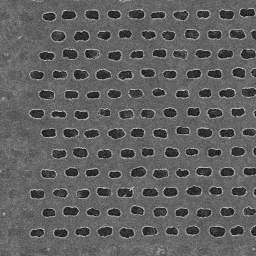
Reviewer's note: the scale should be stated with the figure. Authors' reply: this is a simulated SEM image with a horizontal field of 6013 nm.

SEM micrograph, a regular array of holes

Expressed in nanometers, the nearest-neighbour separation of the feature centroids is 500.